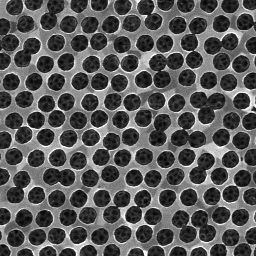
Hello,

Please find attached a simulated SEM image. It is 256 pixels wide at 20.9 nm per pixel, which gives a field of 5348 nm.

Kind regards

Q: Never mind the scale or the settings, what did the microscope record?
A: a regular array of holes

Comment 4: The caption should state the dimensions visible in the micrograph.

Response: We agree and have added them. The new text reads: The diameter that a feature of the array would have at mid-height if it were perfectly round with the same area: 0.342 um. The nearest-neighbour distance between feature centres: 411 nm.